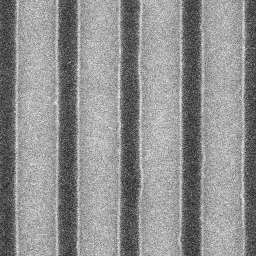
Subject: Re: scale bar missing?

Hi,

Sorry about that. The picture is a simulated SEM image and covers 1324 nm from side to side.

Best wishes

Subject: one or a few lines or trenches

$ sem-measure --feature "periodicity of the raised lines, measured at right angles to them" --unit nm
320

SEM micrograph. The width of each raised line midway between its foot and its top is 116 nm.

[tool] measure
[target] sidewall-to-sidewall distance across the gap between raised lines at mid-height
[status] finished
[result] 207 nm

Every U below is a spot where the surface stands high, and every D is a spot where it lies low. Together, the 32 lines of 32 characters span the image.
UUDDDDDUUUDDDDDUUUDDDDDUUDDDDDUU
UUDDDDDUUUDDDDDUUUDDDDDUUDDDDDUU
UUDDDDDUUUDDDDDUUUDDDDDUUDDDDDUU
UUDDDDDUUUDDDDDUUUDDDDDUUDDDDDUU
UUDDDDDUUUDDDDDUUUDDDDDUUDDDDDUU
UUDDDDDUUUDDDDDUUUDDDDDUUDDDDDUU
UUDDDDDUUUDDDDDUUDDDDDDUUDDDDDUU
UUDDDDDUUUDDDDDUUDDDDDDUUDDDDDUU
UUDDDDDUUUDDDDDUUDDDDDDUUDDDDDUU
UUDDDDDUUUDDDDDUUUDDDDDUUDDDDDUU
UUDDDDDUUUDDDDDUUUDDDDDUUDDDDDUU
UUDDDDDUUUDDDDDUUUDDDDDUUDDDDDUU
UUDDDDDUUUDDDDDUUUDDDDDUUDDDDDUU
UUDDDDDUUUDDDDDUUUDDDDDUUDDDDDUU
UUDDDDDUUUDDDDDUUUDDDDDUUDDDDDUU
UUDDDDDUUUDDDDDUUUDDDDDUUDDDDDUU
UUDDDDDUUUDDDDDUUUDDDDDUUDDDDDDU
UUDDDDDUUUDDDDDUUUDDDDDUUDDDDDUU
UUDDDDDUUUDDDDDUUUDDDDDUUDDDDDUU
UUDDDDDUUUDDDDDUUUDDDDDUUUDDDDUU
UUDDDDDUUUDDDDDUUUDDDDDUUDDDDDUU
UUDDDDDUUUDDDDDUUUDDDDDUUDDDDDUU
UUDDDDDUUUDDDDDUUUDDDDDUUDDDDDUU
UUDDDDDUUUDDDDDUUUDDDDDUUDDDDDUU
UUDDDDDUUUDDDDDUUUDDDDDUUDDDDDUU
UUDDDDDUUUDDDDDUUUDDDDDUUDDDDDUU
UUDDDDDUUUDDDDDUUDDDDDDUUDDDDDUU
UUDDDDDUUUDDDDDUUDDDDDDUUDDDDDUU
UUDDDDDUUUDDDDDUUDDDDDDUUDDDDDUU
UUDDDDDUUUDDDDDUUUDDDDUUUDDDDDDU
UUDDDDDUUUDDDDDUUUDDDDUUUDDDDDDU
UUDDDDDUUUDDDDDUUUDDDDDUUDDDDDDU